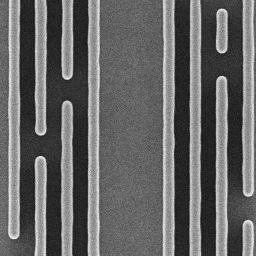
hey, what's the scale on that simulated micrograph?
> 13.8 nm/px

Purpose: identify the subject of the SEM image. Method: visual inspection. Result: groups of lines, slits or small figures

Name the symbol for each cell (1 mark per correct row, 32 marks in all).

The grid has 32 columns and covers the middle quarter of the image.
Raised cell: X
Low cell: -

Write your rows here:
XX----XXX----------------XX-----
XX----XXX----------------XX-----
XX----XXX----------------XX-----
XX----XXX----------------XX-----
------XXX----------------XX-----
------XXX----------------XX-----
------XXX----------------XX-----
------XXX----------------XX-----
------XXX----------------XX-----
XX----XXX----------------XX-----
XX----XXX----------------XX-----
XX----XXX----------------XX-----
XX----XXX----------------XX-----
XX----XXX----------------XX-----
XX----XXX----------------XX-----
XX----XXX----------------XX-----
XX----XXX----------------XX-----
XX----XXX----------------XX-----
XX----XXX----------------XX-----
XX----XXX----------------XX-----
XX----XXX----------------XX-----
XX----XXX----------------XX-----
XX----XXX----------------XX-----
XX----XXX----------------XX-----
XX----XXX----------------XX-----
XX----XXX----------------XX-----
XX----XXX----------------XX-----
XX----XXX----------------XX-----
XX----XXX----------------XX-----
XX----XXX----------------XX-----
XX----XXX----------------XX-----
XX----XXX----------------XX-----